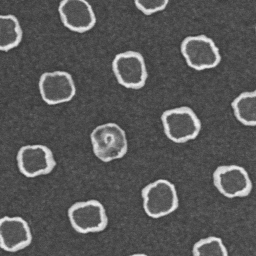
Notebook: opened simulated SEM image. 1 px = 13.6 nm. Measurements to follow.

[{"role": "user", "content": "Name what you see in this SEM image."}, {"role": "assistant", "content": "a regular array of raised bodies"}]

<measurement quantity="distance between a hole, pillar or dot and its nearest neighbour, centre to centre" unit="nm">1010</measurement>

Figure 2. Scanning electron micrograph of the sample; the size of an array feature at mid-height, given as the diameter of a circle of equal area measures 0.455 µm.